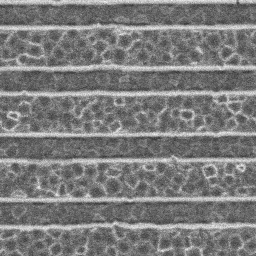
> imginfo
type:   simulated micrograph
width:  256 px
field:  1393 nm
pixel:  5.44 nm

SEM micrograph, one or a few lines or trenches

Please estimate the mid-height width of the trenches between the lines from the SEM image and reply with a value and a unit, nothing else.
140 nm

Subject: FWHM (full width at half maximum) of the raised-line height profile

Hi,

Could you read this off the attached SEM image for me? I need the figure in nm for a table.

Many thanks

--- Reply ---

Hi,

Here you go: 226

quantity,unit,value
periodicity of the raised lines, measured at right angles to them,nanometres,360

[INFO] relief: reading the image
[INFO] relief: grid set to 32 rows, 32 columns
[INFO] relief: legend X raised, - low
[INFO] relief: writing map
--------------------------------
--------------------------------
--------------------------------
X----XX----XXXXXXXXXXXXXXXXXXXXX
XXXXXXXXXXXXXXXXXXXXXXXXXXXXXXXX
XXXXXXXXXXXXXXXXXXXXXXXXXXXXXXXX
XXXXXXXXXXXXXXXXXXXXXXXXXXXXXXXX
XXXXXXXXXXXXXXXXXXXXXXXXXXXXXXXX
XXXX-XXXXX-----XXXXXXXXXXXXX-XXX
--------------------------------
--------------------------------
--------------------------------
XXXXXXXXXXXXXXXXXXXXXXXXXXXXXXXX
XXXXXXXXXXXXXXXXXXXXXXXXXXXXXXXX
XXXXXXXXXXXXXXXXXXXXXXXXXXXXXXXX
XXXXXXXXXXXXXXXXXXXXXXXXXXXXXXXX
XXXXXXXXXXXXXXXXXXXXXXXXXXXXXXXX
--------------------------------
--------------------------------
--------------------------------
XXXXXXXXXXXXXXXXXXXXXXXXXXXXXXXX
XXXXXXXXXXXXXXXXXXXXXXXXXXXXXXXX
XXXXXXXXXXXXXXXXXXXXXXXXXXXXXXXX
XXXXXXXXXXXXXXXXXXXXXXXXXXXXXXXX
XXXXXXXXXXXXXXXXXXXXXXXXXXXXXXXX
--------------------------------
--------------------------------
--------------------------------
XXXXXXXXXXXXXXXXXXXXXXXXXXXXXXXX
XXXXXXXXXXXXXXXXXXXXXXXXXXXXXXXX
XXXXXXXXXXXXXXXXXXXXXXXXXXXXXXXX
XXXXXXXXXXXXXXXXXXXXXXXXXXXXXXXX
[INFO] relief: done